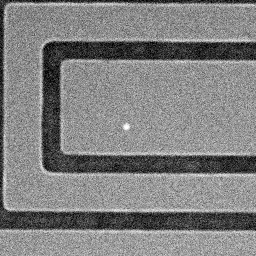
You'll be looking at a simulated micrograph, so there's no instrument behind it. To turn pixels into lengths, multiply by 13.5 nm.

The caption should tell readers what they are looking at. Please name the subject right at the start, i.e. groups of lines, slits or small figures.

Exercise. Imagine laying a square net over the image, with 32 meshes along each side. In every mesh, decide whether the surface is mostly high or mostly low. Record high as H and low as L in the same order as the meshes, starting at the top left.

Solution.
LHHHHHHHHHHHHHHHHLLLLLLLLLLLLLLL
LHHHHHHHHHHHHHHHHHHHHHHHHHHHHHHH
LHHHHHHHHHHHHHHHHHHHHHHHHHHHHHHH
LHHHHHHHHHHHHHHHHHHHHHHHHHHHHHHH
LHHHHHHHHHHHHHHHHHHHHHHHHHHHHHHH
LHHHHHLLLLLLLLLLLLLLLLLLLLLLLLLL
LHHHHLLLLLLLLLLLLLLLLLLLLLLLLLLL
LHHHHLLLLLLLLLLLLLLLLLLLLLLLLLLL
LHHHHLLLHHHHHHHHHHHHHHHHHHHHHHHH
LHHHHLLLHHHHHHHHHHHHHHHHHHHHHHHH
LHHHHLLLHHHHHHHHHHHHHHHHHHHHHHHH
LHHHHLLLHHHHHHHHHHHHHHHHHHHHHHHH
LHHHHLLLHHHHHHHHHHHHHHHHHHHHHHHH
LHHHHLLLHHHHHHHHHHHHHHHHHHHHHHHH
LHHHHLLLHHHHHHHHHHHHHHHHHHHHHHHH
LHHHHLLLHHHHHHHHHHHHHHHHHHHHHHHH
LHHHHLLLHHHHHHHHHHHHHHHHHHHHHHHH
LHHHHLLLHHHHHHHHHHHHHHHHHHHHHHHH
LHHHHLLLHHHHHHHHHHHHHHHHHHHHHHHH
LHHHHLLLLLLLLLLLLLLLLLLLLLLLLLLL
LHHHHLLLLLLLLLLLLLLLLLLLLLLLLLLL
LHHHHHLLLLLLLLLLLLLLLLLLLLLLLLLL
LHHHHHHHHHHHHHHHHHHHHHHHHHHHHHHH
LHHHHHHHHHHHHHHHHHHHHHHHHHHHHHHH
LHHHHHHHHHHHHHHHHHHHHHHHHHHHHHHH
LHHHHHHHHHHHHHHHHHHHHHHHHHHHHHHH
LLLLLLLLLLLLLLLLLLLLLLLLLLLLLLLL
LLLLLLLLLLLLLLLLLLLLLLLLLLLLLLLL
LLLLLLLLLLLLLLLLLLLLLLLLLLLLLLLL
HHHHHHHHHHHHHHHHHHHHHHHHHHHHHHHH
HHHHHHHHHHHHHHHHHHHHHHHHHHHHHHHH
HHHHHHHHHHHHHHHHHHHHHHHHHHHHHHHH